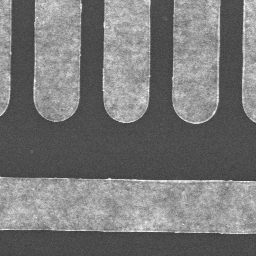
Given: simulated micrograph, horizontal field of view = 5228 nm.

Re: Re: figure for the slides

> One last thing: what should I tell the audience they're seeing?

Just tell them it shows groups of lines, slits or small figures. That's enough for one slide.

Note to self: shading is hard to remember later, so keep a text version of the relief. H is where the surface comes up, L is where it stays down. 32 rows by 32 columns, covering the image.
HLLLHHHHHHLLLHHHHHHLLLHHHHHLLLLH
HLLLHHHHHHLLLHHHHHHLLLHHHHHLLLLH
HLLLHHHHHHLLLHHHHHHLLLHHHHHLLLLH
HLLLHHHHHHLLLHHHHHHLLLHHHHHLLLLH
HLLLHHHHHHLLLHHHHHHLLLHHHHHLLLLH
HLLLHHHHHHLLLHHHHHHLLLHHHHHLLLLH
HLLLHHHHHHLLLHHHHHHLLLHHHHHLLLLH
HLLLHHHHHHLLLHHHHHHLLLHHHHHLLLLH
HLLLHHHHHHLLLHHHHHHLLLHHHHHLLLHH
HLLLHHHHHHLLLHHHHHHLLLHHHHHLLLHH
HLLLHHHHHHLLLHHHHHHLLLHHHHHLLLHH
HLLLHHHHHHLLLHHHHHHLLLHHHHHLLLHH
HLLLHHHHHHLLLHHHHHHLLLHHHHHLLLHH
HLLLLHHHHHLLLHHHHHLLLLHHHHHLLLHH
LLLLLHHHHLLLLLHHHHLLLLHHHHLLLLLH
LLLLLLLLLLLLLLLLLLLLLLLLLLLLLLLL
LLLLLLLLLLLLLLLLLLLLLLLLLLLLLLLL
LLLLLLLLLLLLLLLLLLLLLLLLLLLLLLLL
LLLLLLLLLLLLLLLLLLLLLLLLLLLLLLLL
LLLLLLLLLLLLLLLLLLLLLLLLLLLLLLLL
LLLLLLLLLLLLLLLLLLLLLLLLLLLLLLLL
LLLLLLLLLLLLLLLLLLLLLLLLLLLLLLLL
HHHHHHHHHHHHHHHLLLLLLLLLLLLLLLLL
HHHHHHHHHHHHHHHHHHHHHHHHHHHHHHHH
HHHHHHHHHHHHHHHHHHHHHHHHHHHHHHHH
HHHHHHHHHHHHHHHHHHHHHHHHHHHHHHHH
HHHHHHHHHHHHHHHHHHHHHHHHHHHHHHHH
HHHHHHHHHHHHHHHHHHHHHHHHHHHHHHHH
HHHHHHHHHHHHHHHHHHHHHHHHHHHHHHHH
LLLLLLLLLLLLLLLLLLLLLLLLLLLLLLLL
LLLLLLLLLLLLLLLLLLLLLLLLLLLLLLLL
LLLLLLLLLLLLLLLLLLLLLLLLLLLLLLLL